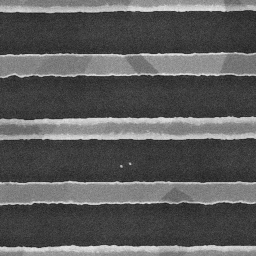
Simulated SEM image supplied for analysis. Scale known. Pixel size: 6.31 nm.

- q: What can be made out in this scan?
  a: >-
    lines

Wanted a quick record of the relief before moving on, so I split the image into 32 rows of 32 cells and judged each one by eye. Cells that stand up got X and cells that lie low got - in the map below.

XXXXXXXXXXXXXXXXXXXXXXXXXXXXXXXX
--------------------------------
--------------------------------
--------------------------------
--------------------------------
--------------------------------
--------------------------------
XXXXXXXXXXXXXXXXXXXXXXXXXXXXXXXX
XXXXXXXXXXXXXXXXXXXXXXXXXXXXXXXX
X-XX-X-XX-----------------------
--------------------------------
--------------------------------
--------------------------------
--------------------------------
--------------------------------
XXXXXXXXXXXXXXXXXXXXXXXXXXXXXXXX
XXXXXXXXXXXXXXXXXXXXXXXXXXXXXXXX
--------------------------------
--------------------------------
--------------------------------
--------------------------------
--------------------------------
--------------------------------
XXXXXXXXXXXXXXXXXXXXXXXXXXXXXXXX
XXXXXXXXXXXXXXXXXXXXXXXXXXXXXXXX
XX-X------XXX------------X------
--------------------------------
--------------------------------
--------------------------------
--------------------------------
--------------------------------
XXXXXXXXXXXXXXXXXXXXXXXXXXXXXXXX